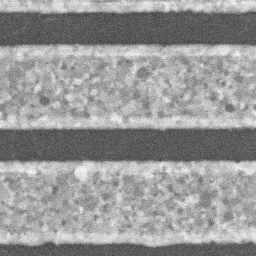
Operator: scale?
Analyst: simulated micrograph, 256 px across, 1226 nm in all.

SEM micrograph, one or a few lines or trenches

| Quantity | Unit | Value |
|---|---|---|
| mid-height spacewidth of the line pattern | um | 0.217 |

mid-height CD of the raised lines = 338 nm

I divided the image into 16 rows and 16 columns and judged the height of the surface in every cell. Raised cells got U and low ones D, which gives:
DDDDDDDDDDDDDDDD
DDDDDDDDDDDDDDDD
DDDDDDDDDDDDDDDD
UUUUUUUUUUUUUUUU
UUUUUUUUUUUUUUUU
UUUUUUUUUUUUUUUU
UUUUUUUUUUUUUUUU
UUUUUUUUUUUUUUUU
DDDDDDDDDDDDDDDD
DDDDDDDDDDDDDDDD
DDDDDUUUUUUUUUUU
UUUUUUUUUUUUUUUU
UUUUUUUUUUUUUUUU
UUUUUUUUUUUUUUUU
UUUUUUUUUUUUUUUU
DDDDDDDDDDDDDDDD